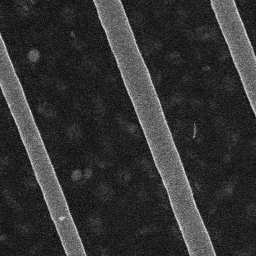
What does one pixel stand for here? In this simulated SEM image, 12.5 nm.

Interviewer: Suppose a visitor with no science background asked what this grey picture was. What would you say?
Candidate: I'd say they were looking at one or a few lines or trenches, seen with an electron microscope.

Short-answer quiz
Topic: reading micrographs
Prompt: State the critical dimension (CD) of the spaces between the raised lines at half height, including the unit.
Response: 1210 nm